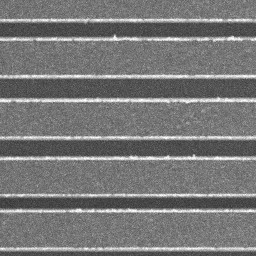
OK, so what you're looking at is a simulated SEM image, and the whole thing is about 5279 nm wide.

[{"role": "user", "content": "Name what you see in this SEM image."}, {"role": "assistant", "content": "parallel lines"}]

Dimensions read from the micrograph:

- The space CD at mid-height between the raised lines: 0.376 um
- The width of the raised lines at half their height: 804 nanometers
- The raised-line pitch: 57.3 px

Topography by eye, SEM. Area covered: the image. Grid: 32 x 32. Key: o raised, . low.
oooooooooooooooooooooooooooooooo
oooooooooooooooooooooooooooooooo
oooooooooooooooooooooooooooooooo
................................
................................
oooooooooooooooooooooooooooooooo
oooooooooooooooooooooooooooooooo
oooooooooooooooooooooooooooooooo
oooooooooooooooooooooooooooooooo
oooooooooooooooooooooooooooooooo
................................
................................
ooo.o..oo.o.oooooo.o....oo.ooooo
oooooooooooooooooooooooooooooooo
oooooooooooooooooooooooooooooooo
oooooooooooooooooooooooooooooooo
oooooooooooooooooooooooooooooooo
................................
................................
................................
oooooooooooooooooooooooooooooooo
oooooooooooooooooooooooooooooooo
oooooooooooooooooooooooooooooooo
oooooooooooooooooooooooooooooooo
o...............................
................................
oooooooooooooooooooooooooooooooo
oooooooooooooooooooooooooooooooo
oooooooooooooooooooooooooooooooo
oooooooooooooooooooooooooooooooo
oooooooooooooooooooooooooooooooo
................................